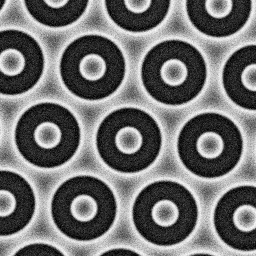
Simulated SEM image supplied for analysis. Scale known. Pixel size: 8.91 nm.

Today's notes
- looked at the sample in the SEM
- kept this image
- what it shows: an array of small figures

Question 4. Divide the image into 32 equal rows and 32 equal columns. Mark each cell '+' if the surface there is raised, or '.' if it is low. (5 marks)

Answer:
.++...++...++...+++..++...+++...
+++........++........++...++...+
++++......++++.......+++.......+
++++++..+++++++....+++++......++
....++++++...+++++++++++++...+++
.....++++......++++.....++++++++
.+...+++.......+++.......++++...
+++...+....++...++........++....
+++...+...+++...++..+++...++...+
.....++....++...++..+++...++..++
.....+++.......+++........++...+
...++++++.....++++.......+++....
++++++++++...++++++.....+++++...
+++.....+++++++..+++++++++++++..
++.......++++......+++++....++++
++........++........+++.......++
++...++...++...++...++........++
++...++...++...++...++...+++..++
++........++...++...++...+++..++
+++......+++........++....+...++
++++....+++++......++++.......++
..+++++++++++++..+++++++.....+++
...+++++.....+++++++.+++++++++++
....+++.......++++.....++++++...
+...+++.......+++.......++++....
++...+...+++...++...+....++.....
+...++...+++...+...+++...++...++
....+++.......++....++...++..+++
...++++.......+++.......+++...++
.+++++++.....+++++......+++.....
+++...+++++++++++++...++++++....
++......+++++....+++++++++++++++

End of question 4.